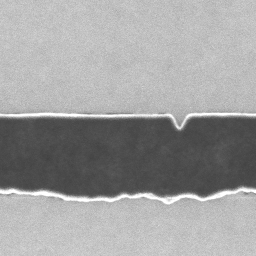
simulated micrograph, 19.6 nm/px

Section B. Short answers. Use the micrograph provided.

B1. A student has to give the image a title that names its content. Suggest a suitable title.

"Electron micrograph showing one or a few lines or trenches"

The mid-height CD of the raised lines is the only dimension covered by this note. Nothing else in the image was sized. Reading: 83.1 px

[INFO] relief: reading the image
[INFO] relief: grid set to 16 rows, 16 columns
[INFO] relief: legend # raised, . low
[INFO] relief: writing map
................
................
................
................
................
................
................
###########.####
################
################
################
################
.....##...#.....
................
................
................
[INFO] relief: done